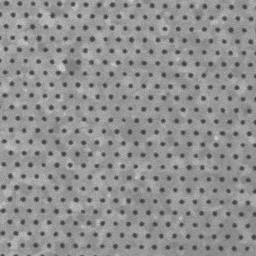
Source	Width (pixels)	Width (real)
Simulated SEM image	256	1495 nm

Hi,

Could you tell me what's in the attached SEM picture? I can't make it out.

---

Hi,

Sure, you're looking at a regular array of holes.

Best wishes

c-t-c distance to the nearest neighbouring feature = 75.5 nm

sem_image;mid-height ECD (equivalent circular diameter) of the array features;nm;28.7